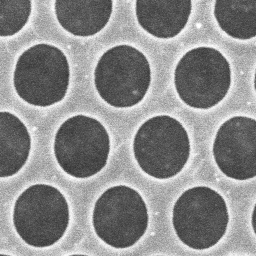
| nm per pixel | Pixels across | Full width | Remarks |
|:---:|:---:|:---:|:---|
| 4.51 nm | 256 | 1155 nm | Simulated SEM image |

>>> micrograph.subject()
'a regular array of holes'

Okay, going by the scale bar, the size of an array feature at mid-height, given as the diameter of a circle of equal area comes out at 271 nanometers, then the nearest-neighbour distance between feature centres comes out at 360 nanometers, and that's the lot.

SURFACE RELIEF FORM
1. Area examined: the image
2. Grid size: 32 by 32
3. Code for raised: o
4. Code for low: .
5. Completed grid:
....ooo.......ooo.......ooo.....
....ooo.......ooo.......ooo.....
....ooo.......ooo.......ooo.....
...ooooo.....ooooo.....ooooo....
.ooooooooo..ooooooo...ooooooo...
ooooo.oooooooooooooooooooooooooo
ooo.....ooooo.....ooooo....ooooo
oo......oooo......oooo......oooo
oo.......ooo.......ooo.......ooo
oo.......ooo.......ooo.......ooo
oo.......ooo.......ooo.......ooo
oo......oooo......oooo.......ooo
ooo.....ooooo.....ooooo.....oooo
oooooooooooooooooooooooo..oooooo
..ooooooo..ooooooooo.ooooooooooo
...ooooo.....ooooo.....ooooo....
....ooo......oooo......oooo.....
....ooo.......ooo.......ooo.....
....ooo.......ooo.......ooo.....
....ooo.......ooo.......ooo.....
...oooo......oooo......oooo.....
..oooooo....oooooo....oooooo....
oooooooooooooooooooooooooooooooo
ooo....ooooooo..oooooooo..oooooo
oo......ooooo.....ooooo.....oooo
oo......oooo......oooo......oooo
oo.......ooo......oooo.......ooo
oo.......oo........oo........oo.
oo......oooo......oooo......oooo
oo......oooo......oooo......oooo
ooo....oooooo....oooooo....ooooo
oooooooooooooooooooooooooooooooo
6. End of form